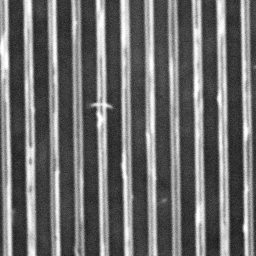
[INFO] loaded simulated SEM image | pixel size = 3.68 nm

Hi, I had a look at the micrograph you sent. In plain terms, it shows parallel lines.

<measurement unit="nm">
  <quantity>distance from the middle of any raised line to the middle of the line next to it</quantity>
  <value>88.7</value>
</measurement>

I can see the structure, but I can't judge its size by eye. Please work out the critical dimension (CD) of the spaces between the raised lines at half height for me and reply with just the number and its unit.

62.9 nm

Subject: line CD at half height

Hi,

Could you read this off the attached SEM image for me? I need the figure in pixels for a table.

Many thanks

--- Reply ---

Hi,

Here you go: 6.74